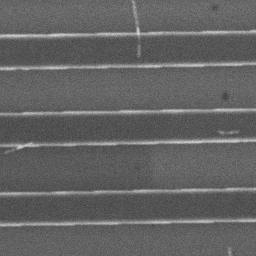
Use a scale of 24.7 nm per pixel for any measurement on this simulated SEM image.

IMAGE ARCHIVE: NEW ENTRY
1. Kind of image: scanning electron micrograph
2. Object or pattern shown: lines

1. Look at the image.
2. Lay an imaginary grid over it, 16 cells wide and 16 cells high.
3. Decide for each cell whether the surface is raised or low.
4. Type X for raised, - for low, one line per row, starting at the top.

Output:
----------------
----------------
XXXXXXXXXXXXXXXX
XXXXXXXXXXXXXXXX
----------------
----------------
----------------
XXXXXXXXXXXXXXXX
XXXXXXXXXXXXXXXX
----------------
----------------
----------------
XXXXXXXXXXXXXXXX
XXXXXXXXXXXXXXXX
----------------
----------------